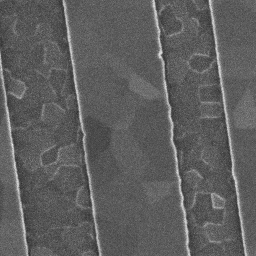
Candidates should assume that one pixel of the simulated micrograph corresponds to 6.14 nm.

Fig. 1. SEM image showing one or a few lines or trenches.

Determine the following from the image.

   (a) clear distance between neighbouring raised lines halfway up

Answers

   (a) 338 nanometres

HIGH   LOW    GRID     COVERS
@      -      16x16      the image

----@@@@@@---@@@
----@@@@@@---@@@
----@@@@@@---@@@
----@@@@@@----@@
-----@@@@@@---@@
-----@@@@@----@@
-----@@@@@@---@@
@----@@@@@@---@@
@----@@@@@@---@@
@----@@@@@@---@@
@----@@@@@@----@
@-----@@@@@----@
@-----@@@@@----@
@-----@@@@@@---@
@@----@@@@@@---@
@@----@@@@@@---@